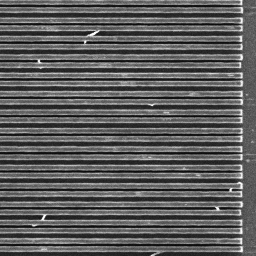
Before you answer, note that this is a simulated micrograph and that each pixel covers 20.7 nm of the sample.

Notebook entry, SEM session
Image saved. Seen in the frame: parallel lines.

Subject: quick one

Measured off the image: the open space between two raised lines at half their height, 90.6 nm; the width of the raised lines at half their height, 0.111 micrometres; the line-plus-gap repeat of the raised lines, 9.19 px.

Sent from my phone